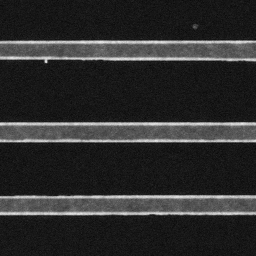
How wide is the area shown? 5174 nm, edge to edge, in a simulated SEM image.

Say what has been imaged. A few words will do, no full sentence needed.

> lines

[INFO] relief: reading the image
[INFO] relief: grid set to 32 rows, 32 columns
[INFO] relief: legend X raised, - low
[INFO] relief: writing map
--------------------------------
--------------------------------
--------------------------------
--------------------------------
--------------------------------
XXXXXXXXXXXXXXXXXXXXXXXXXXXXXXXX
XXXXXXXXXXXXXXXXXXXXXXXXXXXXXXXX
--------------------------------
--------------------------------
--------------------------------
--------------------------------
--------------------------------
--------------------------------
--------------------------------
--------------------------------
XXXXXXXXXXXXXXXXXXXXXXXXXXXXXXXX
XXXXXXXXXXXXXXXXXXXXXXXXXXXXXXXX
XXXXXXXXXXXXXXXXXXXXXXXXXXXXXXXX
--------------------------------
--------------------------------
--------------------------------
--------------------------------
--------------------------------
--------------------------------
--------------------------------
XXXXXXXXXXXXXXXXXXXXXXXXXXXXXXXX
XXXXXXXXXXXXXXXXXXXXXXXXXXXXXXXX
--------------------------------
--------------------------------
--------------------------------
--------------------------------
--------------------------------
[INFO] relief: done